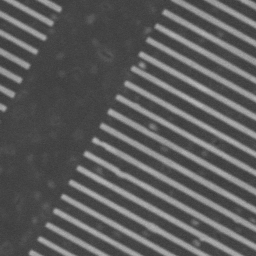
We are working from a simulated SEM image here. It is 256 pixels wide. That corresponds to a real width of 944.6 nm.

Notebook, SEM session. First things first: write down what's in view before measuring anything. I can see parallel lines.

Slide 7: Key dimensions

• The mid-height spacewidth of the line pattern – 0.04 microns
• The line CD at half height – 19.8 nanometres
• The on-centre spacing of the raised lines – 0.0597 microns